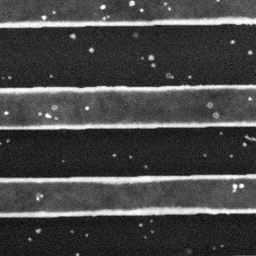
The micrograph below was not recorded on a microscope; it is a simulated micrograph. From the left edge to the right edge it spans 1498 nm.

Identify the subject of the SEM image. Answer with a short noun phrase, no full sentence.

lines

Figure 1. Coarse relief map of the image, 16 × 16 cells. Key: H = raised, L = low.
HHHHHHHHHHHHHHHH
HHHHHHHHHHLLLLLL
LLLLLLLLLLLLLLLL
LLLLLLLLLLLLLLLL
LLLLLLLLLLLLLLLL
LLLHHHHHHHHHHHHH
HHHHHHHHHHHHHHHH
HHHHHHHHHHHHHHHH
LLLLLLLLLLLLLLLL
LLLLLLLLLLLLLLLL
LLLLLLLLLLLLLLLL
HHHHHHHHHHHHHHHH
HHHHHHHHHHHHHHHH
LLLLLLLLLLLLLLLL
LLLLLLLLLLLLLLLL
LLLLLLLLLLLLLLLL